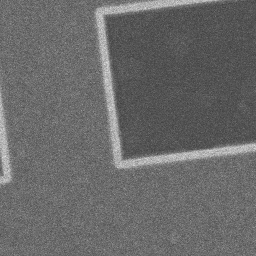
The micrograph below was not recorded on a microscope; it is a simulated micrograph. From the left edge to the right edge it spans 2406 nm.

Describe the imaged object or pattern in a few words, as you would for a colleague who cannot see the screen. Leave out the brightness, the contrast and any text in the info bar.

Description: one or a few lines or trenches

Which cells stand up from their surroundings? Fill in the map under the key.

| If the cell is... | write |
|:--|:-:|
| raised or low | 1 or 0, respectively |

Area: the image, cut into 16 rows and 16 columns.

1111111100000000
1111110000000000
1111110000000000
1111111000000000
1111111000000000
1111111000000000
1111111000000000
1111111000000000
1111111000000000
1111111000000111
1111111111111111
1111111111111111
1111111111111111
1111111111111111
1111111111111111
1111111111111111